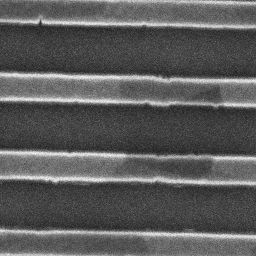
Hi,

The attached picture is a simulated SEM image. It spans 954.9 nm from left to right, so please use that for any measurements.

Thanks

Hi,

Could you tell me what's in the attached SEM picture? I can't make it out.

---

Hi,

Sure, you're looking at one or a few lines or trenches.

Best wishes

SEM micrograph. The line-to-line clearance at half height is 198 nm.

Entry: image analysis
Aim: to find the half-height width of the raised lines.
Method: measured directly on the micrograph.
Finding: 91.3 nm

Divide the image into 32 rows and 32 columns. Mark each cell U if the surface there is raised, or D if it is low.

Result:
UUUUUUUUUUUUUUUUUUUUUUUUUUUUUUUU
UUUUUUUUUUUUUUUUUUUUUUUUUUUUUUUU
UUUUUUUUUUUUUUUUUUUUUUUUUUUUUUUU
DDDDDDDDDDDDDDDDDDDDDDDDDDDDDDDD
DDDDDDDDDDDDDDDDDDDDDDDDDDDDDDDD
DDDDDDDDDDDDDDDDDDDDDDDDDDDDDDDD
DDDDDDDDDDDDDDDDDDDDDDDDDDDDDDDD
DDDDDDDDDDDDDDDDDDDDDDDDDDDDDDDD
DDDDDDDDDDDDDDDDDDDDDDDDDDDDDDDD
UUUUUUUUDDDDDDDDDDDDDDDDDDDDDDDD
UUUUUUUUUUUUUUUUUUUUUUUUUUUUUUUU
UUUUUUUUUUUUUUUUUUUUUUUUUUUUUUUU
DDDDDDUUUUUUUUUUUUUUUUUUUUUUUUUU
DDDDDDDDDDDDDDDDDDDDDDDDDDDDDDDD
DDDDDDDDDDDDDDDDDDDDDDDDDDDDDDDD
DDDDDDDDDDDDDDDDDDDDDDDDDDDDDDDD
DDDDDDDDDDDDDDDDDDDDDDDDDDDDDDDD
DDDDDDDDDDDDDDDDDDDDDDDDDDDDDDDD
DDDDDDDDDDDDDDDDDDDDDDDDDDDDDDDD
UUUUUUUUUUUUUUUUUDDDDDDDDDDDDDDD
UUUUUUUUUUUUUUUUUUUUUUUUUUUUUUUU
UUUUUUUUUUUUUUUUUUUUUUUUUUUUUUUU
DDDDDDDDDDDDDDDDDDDUUUUUUUUUUUUU
DDDDDDDDDDDDDDDDDDDDDDDDDDDDDDDD
DDDDDDDDDDDDDDDDDDDDDDDDDDDDDDDD
DDDDDDDDDDDDDDDDDDDDDDDDDDDDDDDD
DDDDDDDDDDDDDDDDDDDDDDDDDDDDDDDD
DDDDDDDDDDDDDDDDDDDDDDDDDDDDDDDD
DDDDDDDDDDDDDDDDDDDDDDDDDDDDDDDD
UUUUUUUUUUUUUUUUUUUUUUUUUUUUUUDD
UUUUUUUUUUUUUUUUUUUUUUUUUUUUUUUU
UUUUUUUUUUUUUUUUUUUUUUUUUUUUUUUU